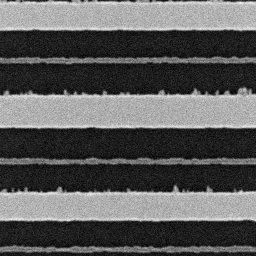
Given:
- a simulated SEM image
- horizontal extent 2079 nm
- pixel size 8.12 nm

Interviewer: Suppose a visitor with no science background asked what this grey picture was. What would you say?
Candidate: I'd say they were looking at lines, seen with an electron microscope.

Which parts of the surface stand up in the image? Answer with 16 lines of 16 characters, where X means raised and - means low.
XXXXXXXXXXXXXXXX
XXXXXXXXXXXXXXXX
----------------
----------------
----------------
----------------
XXXXXXXXXXXXXXXX
XXXXXXXXXXXXXXXX
----------------
----------------
----------------
----------------
XXXXXXXXXXXXXXXX
XXXXXXXXXXXXXXXX
----------------
----------------